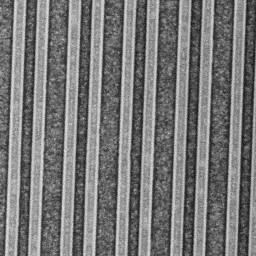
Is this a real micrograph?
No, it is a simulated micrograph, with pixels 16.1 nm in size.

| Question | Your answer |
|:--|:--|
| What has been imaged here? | parallel lines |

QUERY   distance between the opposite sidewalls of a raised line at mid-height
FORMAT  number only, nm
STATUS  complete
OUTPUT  161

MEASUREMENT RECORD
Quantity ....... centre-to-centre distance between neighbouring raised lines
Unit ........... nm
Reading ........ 444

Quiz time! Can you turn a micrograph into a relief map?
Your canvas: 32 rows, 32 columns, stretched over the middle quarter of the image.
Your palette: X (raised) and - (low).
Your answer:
-XX----XX------XX----XX------XX-
-XX----XX------XX----XX------XX-
-XX----XX------XX----XX------XX-
-XX----XX------XX---XXX------XX-
-XX----XX------XX---XXX-----XXX-
-XX----XX------XX---XXX-----XXX-
-XX----XX------XX---XXX-----XXX-
-XX----XX------XX---XXX-----XXX-
-XX----XX------XX---XXX-----XXX-
-XX----XX------XX---XXX-----XXX-
-XX---XXX-----XXX---XXX-----XXX-
-XX---XXX-----XXX---XX------XX--
-XX---XXX-----XXX---XX------XX--
-XX---XXX-----XXX---XX------XX--
-XX---XXX-----XXX---XX------XX--
-XX---XXX-----XXX---XX------XX--
-XX---XXX-----XXX---XX------XX--
XXX---XXX-----XXX---XX------XX--
XXX---XX------XX----XX------XX--
XXX---XX------XX----XX------XX--
XXX---XX------XX----XX------XX--
XXX---XX------XX----XX------XX--
XXX---XX------XX----XX------XX--
XXX---XX------XX----XX------XX--
XXX---XX------XX----XX------XX--
XX----XX------XX----XX------XX--
XX----XX------XX----XX------XX--
XX----XX------XX----XX------XX--
XX----XX------XX----XX------XX--
XX----XX------XX----XX------XX--
XX----XX------XX----XX------XX--
XX----XX------XX---XXX-----XXX--